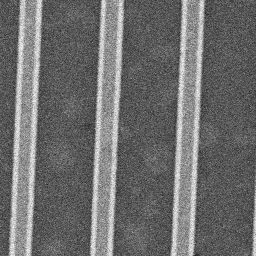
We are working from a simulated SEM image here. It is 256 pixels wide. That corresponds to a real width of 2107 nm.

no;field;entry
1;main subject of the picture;one or a few lines or trenches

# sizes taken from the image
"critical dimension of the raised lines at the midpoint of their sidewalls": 142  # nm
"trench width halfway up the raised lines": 525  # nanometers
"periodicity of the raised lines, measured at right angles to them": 667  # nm